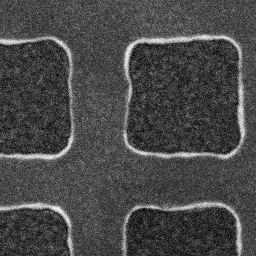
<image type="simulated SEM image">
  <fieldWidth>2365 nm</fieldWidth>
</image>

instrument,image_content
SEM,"holes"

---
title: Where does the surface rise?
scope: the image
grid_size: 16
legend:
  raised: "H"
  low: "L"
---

HHHHHHHHHHHHHHHH
HHHHHHHHHHHHHHHH
HHHHHHHHHHHLLLHH
LLLLHHHHLLLLLLLH
LLLLHHHHLLLLLLLH
LLLLHHHHLLLLLLLH
LLLLHHHHLLLLLLLH
LLLLHHHHLLLLLLLH
LLLLHHHHLLLLLLLH
LLLLHHHHHLLLLLLH
HHHHHHHHHHHHHHHH
HHHHHHHHHHHHHHHH
HHHHHHHHHHHHHHHH
LLLLHHHHLLLLLLLH
LLLLHHHHLLLLLLLH
LLLLHHHHLLLLLLLH